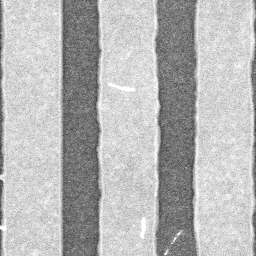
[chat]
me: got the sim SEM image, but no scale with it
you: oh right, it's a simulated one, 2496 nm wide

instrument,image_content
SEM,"one or a few lines or trenches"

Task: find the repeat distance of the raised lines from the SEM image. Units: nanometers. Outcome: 939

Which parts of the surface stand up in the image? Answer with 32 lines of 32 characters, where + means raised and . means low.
++++++++....+++++++......+++++++
++++++++....++++++++.....+++++++
++++++++.....+++++++.....+++++++
++++++++....++++++++.....+++++++
++++++++.....++++++......+++++++
++++++++.....++++++......+++++++
++++++++.....++++++......+++++++
++++++++.....++++++......++++++.
++++++++....+++++++......++++++.
++++++++....++++++++.....++++++.
++++++++....++++++++.....++++++.
++++++++....++++++++.....++++++.
++++++++....++++++++.....+++++++
++++++++....++++++++.....+++++++
.+++++++....++++++++.....+++++++
++++++++.....+++++++.....+++++++
++++++++.....+++++++.....+++++++
++++++++....++++++++.....+++++++
++++++++....++++++++.....+++++++
.+++++++....++++++++....++++++++
++++++++.....+++++++....++++++++
++++++++.....+++++++....++++++++
++++++++.....+++++++....++++++++
++++++++.....+++++++....++++++++
++++++++.....+++++++....++++++++
++++++++.....+++++++....++++++++
++++++++....++++++++....++++++++
.+++++++....+++++++.....+++++++.
++++++++....+++++++.....++++++++
++++++++....+++++++......+++++++
++++++++....+++++++......+++++++
++++++++....+++++++......+++++++